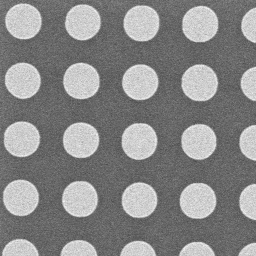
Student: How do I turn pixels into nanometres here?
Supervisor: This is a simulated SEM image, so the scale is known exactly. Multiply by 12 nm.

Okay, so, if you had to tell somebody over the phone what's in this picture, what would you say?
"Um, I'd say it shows an array of small figures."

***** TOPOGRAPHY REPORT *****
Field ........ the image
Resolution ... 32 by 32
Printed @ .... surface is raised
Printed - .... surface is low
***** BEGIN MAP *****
--------------------------------
-@@@@----@@@----@@@----@@@@----@
-@@@@---@@@@----@@@@---@@@@---@@
-@@@@---@@@@----@@@@---@@@@---@@
--@@-----@@@----@@@----@@@@----@
--------------------------------
--------------------------------
--------------------------------
-@@@-----@@@----@@@-----@@-----@
-@@@@---@@@@---@@@@@---@@@@---@@
-@@@@---@@@@---@@@@@---@@@@---@@
-@@@----@@@@----@@@----@@@@---@@
------------------------@@-----@
--------------------------------
--------------------------------
--@@-----@@------@--------------
-@@@@---@@@@----@@@----@@@@---@@
-@@@@---@@@@---@@@@@---@@@@---@@
-@@@@---@@@@---@@@@----@@@@---@@
--@------@@-----@@@-----@@-----@
--------------------------------
--------------------------------
--@-----------------------------
-@@@----@@@@----@@@----@@@-----@
@@@@@---@@@@---@@@@@---@@@@---@@
-@@@@---@@@@---@@@@@---@@@@---@@
-@@@----@@@@----@@@----@@@----@@
--------------------------------
--------------------------------
--------------------------------
-@@@----@@@-----@@@-----@@-----@
@@@@@---@@@@---@@@@----@@@@---@@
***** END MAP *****